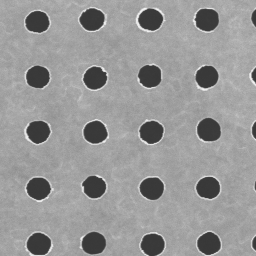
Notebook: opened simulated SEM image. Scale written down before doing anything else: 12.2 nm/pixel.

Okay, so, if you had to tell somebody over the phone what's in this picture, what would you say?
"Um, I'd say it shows a regular array of holes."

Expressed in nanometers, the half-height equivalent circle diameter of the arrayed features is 279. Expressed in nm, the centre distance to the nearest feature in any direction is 671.